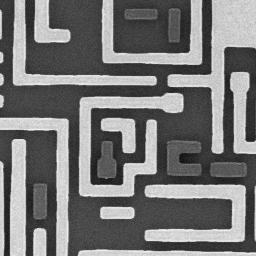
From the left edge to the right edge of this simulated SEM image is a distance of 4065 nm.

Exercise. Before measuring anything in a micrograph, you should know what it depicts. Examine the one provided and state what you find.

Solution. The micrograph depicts wiring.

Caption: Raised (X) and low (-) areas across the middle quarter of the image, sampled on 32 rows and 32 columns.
--------------------------------
--------------------------------
--------------------------------
XXXXXXXXXXXXXXXXXXXXXXX---XXXXXX
XXXXXXXXXXXXXXXXXXXXXXX---XXXXXX
---------------------------XXX--
--------------------------------
--------------------------------
-----XXXXXXXXXXXXXXXXXXXXXXXXX--
----XXXXXXXXXXXXXXXXXXXXXXXXXX--
----XXXXXXXXXXXXXXXXXXXXXXXXXX--
----XXX------------------XXXXX--
----XXX-------------------------
----XXX-------------------------
X---XXX--XXXXXXXX----XX---------
X---XXX--XXXXXXXX----XX---------
X---XXX---XXXXXXXX---XX---------
X---XXX--------XXX---XX---------
X---XXX--------XXX---XX---------
X---XXX---XX---XXX--XXX---XXXXXX
X---XXX---XX---XXX--XXX---XXXXXX
X---XXX---XX---XXX--XXX---XXXXXX
X---XXX---XX--------XXX---XXX---
X---XXX--XXX--------XXX---XXX---
X---XX--XXXXX-------XXX---XXX---
X---XX--XXXXX--XXXXXXXX---XXXXXX
X---XX--XXXXX--XXXXXXXX---XXXXXX
X---XX--XXXXX--XXX--------XXXXXX
X---XX---------XX---------------
X---XXX--------XX---------------
X---XXXXXXXXXXXXX----XXXXXXXXXXX
X---XXXXXXXXXXXXX---XXXXXXXXXXXX